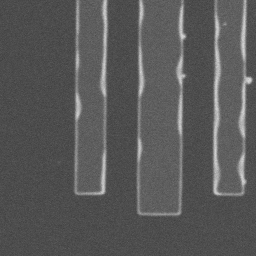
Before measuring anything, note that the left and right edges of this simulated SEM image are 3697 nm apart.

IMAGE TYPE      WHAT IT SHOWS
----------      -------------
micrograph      groups of lines, slits or small figures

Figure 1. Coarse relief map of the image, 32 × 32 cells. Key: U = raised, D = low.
DDDDDDDDDDUUUDDDDDUUUUUDDDDUUUUD
DDDDDDDDDDUUUDDDDDUUUUUDDDDUUUUD
DDDDDDDDDDUUUDDDDDUUUUUDDDDUUUUD
DDDDDDDDDDUUUDDDDUUUUUUDDDDUUUDD
DDDDDDDDDDUUUDDDDUUUUUUDDDDUUUDD
DDDDDDDDDDUUUDDDDUUUUUUDDDDUUUDD
DDDDDDDDDDUUUDDDDUUUUUUDDDDUUUDD
DDDDDDDDDDUUUDDDDDUUUUUDDDDUUUUD
DDDDDDDDDDUUUDDDDDUUUUDDDDDUUUUD
DDDDDDDDDDUUUDDDDDUUUUDDDDDUUUUD
DDDDDDDDDDUUUDDDDDUUUUUDDDDUUUUD
DDDDDDDDDDUUUDDDDUUUUUUDDDDUUUDD
DDDDDDDDDDUUUDDDDUUUUUUDDDDUUUDD
DDDDDDDDDDUUUDDDDUUUUUUDDDDUUUDD
DDDDDDDDDDUUUDDDDUUUUUDDDDDUUUDD
DDDDDDDDDDUUUDDDDUUUUUDDDDDUUUDD
DDDDDDDDDDUUUDDDDUUUUUUDDDDUUUDD
DDDDDDDDDDUUUDDDDUUUUUUDDDDUUUDD
DDDDDDDDDDUUUDDDDUUUUUUDDDDUUUDD
DDDDDDDDDDUUUDDDDUUUUUUDDDDUUUDD
DDDDDDDDDDUUUDDDDUUUUUUDDDDUUUDD
DDDDDDDDDDUUUDDDDUUUUUUDDDDUUUDD
DDDDDDDDDDUUUDDDDUUUUUUDDDDUUUDD
DDDDDDDDDUUUUDDDDUUUUUUDDDDUUUDD
DDDDDDDDDDDDDDDDDUUUUUUDDDDDDDDD
DDDDDDDDDDDDDDDDDUUUUUDDDDDDDDDD
DDDDDDDDDDDDDDDDDUUUUUDDDDDDDDDD
DDDDDDDDDDDDDDDDDDDDDDDDDDDDDDDD
DDDDDDDDDDDDDDDDDDDDDDDDDDDDDDDD
DDDDDDDDDDDDDDDDDDDDDDDDDDDDDDDD
DDDDDDDDDDDDDDDDDDDDDDDDDDDDDDDD
DDDDDDDDDDDDDDDDDDDDDDDDDDDDDDDD